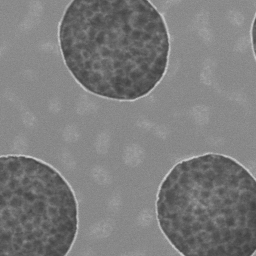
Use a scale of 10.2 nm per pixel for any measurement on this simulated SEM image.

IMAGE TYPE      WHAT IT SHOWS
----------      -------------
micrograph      holes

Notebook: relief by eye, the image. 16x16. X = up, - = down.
XXXX------XXXXXX
XXXX------XXXXXX
XXXX-------XXXXX
XXXX------XXXXXX
XXXX------XXXXXX
XXXXX-----XXXXXX
XXXXXXXXXXXXXXXX
XXXXXXXXXXXXXXXX
XXXXXXXXXXXXXXXX
XXXXXXXXXXXXXXXX
---XXXXXXXX----X
----XXXXXX------
-----XXXXX------
-----XXXXX------
-----XXXXX------
----XXXXXXX-----